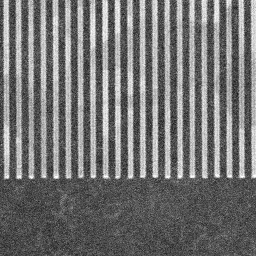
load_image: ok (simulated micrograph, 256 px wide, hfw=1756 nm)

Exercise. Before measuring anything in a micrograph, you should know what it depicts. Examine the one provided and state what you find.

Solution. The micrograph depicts parallel lines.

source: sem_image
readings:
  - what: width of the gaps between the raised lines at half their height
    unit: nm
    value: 59.2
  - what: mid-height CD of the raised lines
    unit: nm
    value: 26.6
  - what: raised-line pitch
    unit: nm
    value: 85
